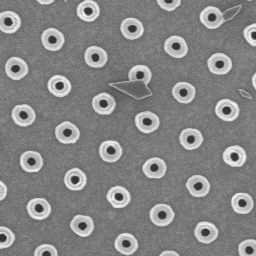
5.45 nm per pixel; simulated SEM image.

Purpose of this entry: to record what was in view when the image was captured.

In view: a regular array of ring-shaped raised bodies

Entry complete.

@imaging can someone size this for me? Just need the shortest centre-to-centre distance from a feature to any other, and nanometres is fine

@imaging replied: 252